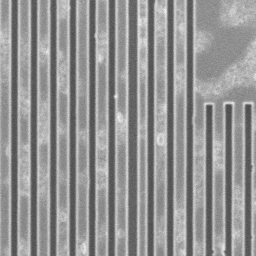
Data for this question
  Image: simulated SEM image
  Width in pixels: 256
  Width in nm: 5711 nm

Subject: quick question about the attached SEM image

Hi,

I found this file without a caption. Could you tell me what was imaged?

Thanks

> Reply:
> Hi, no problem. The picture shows parallel lines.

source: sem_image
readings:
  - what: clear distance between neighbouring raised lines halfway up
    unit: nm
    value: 167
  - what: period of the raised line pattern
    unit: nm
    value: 435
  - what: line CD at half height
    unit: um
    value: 0.262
